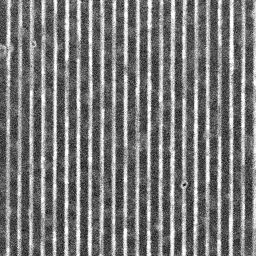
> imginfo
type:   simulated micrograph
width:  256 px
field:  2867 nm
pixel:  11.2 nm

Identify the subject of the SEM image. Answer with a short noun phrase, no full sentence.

parallel lines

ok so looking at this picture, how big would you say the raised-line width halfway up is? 0.0266 µm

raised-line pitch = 132 nm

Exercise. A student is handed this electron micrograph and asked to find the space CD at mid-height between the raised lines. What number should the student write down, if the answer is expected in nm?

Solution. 105